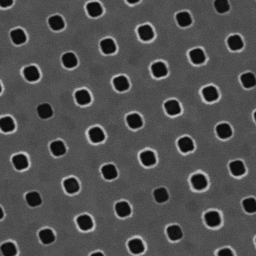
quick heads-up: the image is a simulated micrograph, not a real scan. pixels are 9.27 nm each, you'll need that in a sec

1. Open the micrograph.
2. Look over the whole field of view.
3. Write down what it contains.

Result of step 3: a regular array of holes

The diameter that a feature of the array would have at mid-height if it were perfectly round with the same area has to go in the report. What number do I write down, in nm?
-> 152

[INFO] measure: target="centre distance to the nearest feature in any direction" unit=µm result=0.365